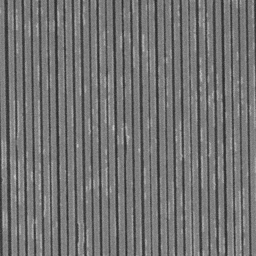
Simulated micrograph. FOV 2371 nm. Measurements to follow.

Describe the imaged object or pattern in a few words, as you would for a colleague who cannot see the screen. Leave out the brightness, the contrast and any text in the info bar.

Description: parallel lines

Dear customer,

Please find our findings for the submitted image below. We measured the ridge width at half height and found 50.9 nanometres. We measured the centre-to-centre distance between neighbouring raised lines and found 76.8 nanometres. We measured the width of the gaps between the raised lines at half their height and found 25.5 nm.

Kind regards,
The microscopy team